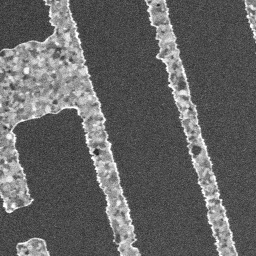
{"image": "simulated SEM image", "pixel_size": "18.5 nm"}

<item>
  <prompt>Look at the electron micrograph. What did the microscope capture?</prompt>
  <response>one or a few lines or trenches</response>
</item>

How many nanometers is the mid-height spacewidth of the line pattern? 1400